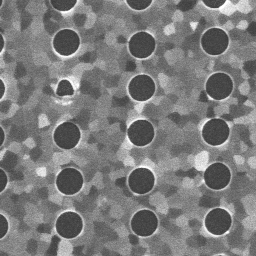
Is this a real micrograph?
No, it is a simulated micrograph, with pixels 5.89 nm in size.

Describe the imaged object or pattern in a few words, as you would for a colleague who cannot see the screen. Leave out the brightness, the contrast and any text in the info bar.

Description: a regular array of holes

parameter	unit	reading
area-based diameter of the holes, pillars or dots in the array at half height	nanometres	161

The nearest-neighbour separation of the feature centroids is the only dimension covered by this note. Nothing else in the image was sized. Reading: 261 nm